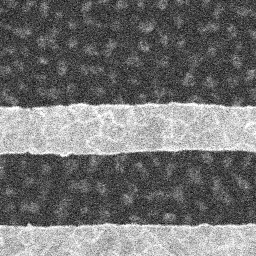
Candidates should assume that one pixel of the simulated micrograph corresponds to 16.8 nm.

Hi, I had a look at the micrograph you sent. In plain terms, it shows one or a few lines or trenches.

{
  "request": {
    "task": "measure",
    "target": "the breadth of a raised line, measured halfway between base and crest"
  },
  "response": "763 nanometres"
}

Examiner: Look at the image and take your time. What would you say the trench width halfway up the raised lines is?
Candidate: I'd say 1240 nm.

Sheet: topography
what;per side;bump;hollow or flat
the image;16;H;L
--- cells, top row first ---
LLLLLLLLLLLLLLLL
LLLLLLLLLLLLLLLL
LLLLLLLLLLLLLLLL
LLLLLLLLLLLLLLLL
LLLLLLLLLLLLLLLL
LLLLLLLLLLLLLLLL
LLLLLLLLLLLLLLLL
HHHHHHHHHHHHHHHH
HHHHHHHHHHHHHHHH
HLHHHHHHLLLLLLLL
LLLLLLLLLLLLLLLL
LLLLLLLLLLLLLLLL
LLLLLLLLLLLLLLLL
LLLLLLLLLLLLLLLL
HHHHHHHHHHHHHHHH
HHHHHHHHHHHHHHHH